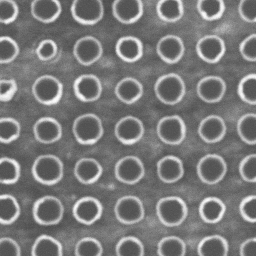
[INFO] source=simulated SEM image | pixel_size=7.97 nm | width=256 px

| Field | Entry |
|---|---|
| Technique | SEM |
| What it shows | a regular array of raised bodies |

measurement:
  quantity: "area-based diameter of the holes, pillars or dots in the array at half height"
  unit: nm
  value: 212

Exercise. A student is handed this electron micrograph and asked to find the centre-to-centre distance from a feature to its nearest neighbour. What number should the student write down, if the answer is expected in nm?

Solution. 318